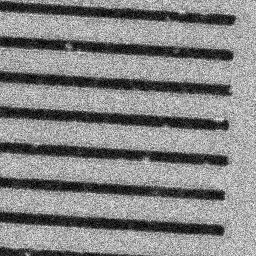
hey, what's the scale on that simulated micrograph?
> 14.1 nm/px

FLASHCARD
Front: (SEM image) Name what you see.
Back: parallel lines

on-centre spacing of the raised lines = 495 nm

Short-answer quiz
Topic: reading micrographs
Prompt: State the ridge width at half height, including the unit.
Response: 192 nm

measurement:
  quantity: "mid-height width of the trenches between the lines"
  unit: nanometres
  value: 300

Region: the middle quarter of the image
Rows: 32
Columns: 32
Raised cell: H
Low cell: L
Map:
LLLLLLLLLLLLLLLLLLLLLLLLLLLLLLLL
LLLLLLLLLLLLLLLLLLLLLLLLLLLLLLLL
LLLLLLLLLLLLLLLLLLLLLLLLLLLLLLLL
HHHHHHHHHHHHHHHHLLLLLLLLLLLLLLLL
HHHHHHHHHHHHHHHHHHHHHHHHHHHHHHHH
HHHHHHHHHHHHHHHHHHHHHHHHHHHHHHHH
LLLLLLLLLLHLHHHHHHHHHHHHHHHHHHHH
LLLLLLLLLLLLLLLLLLLLLLLLLLLLLHHH
LLLLLLLLLLLLLLLLLLLLLLLLLLLLLLLL
LLLLLLLLLLLLLLLLLLLLLLLLLLLLLLLL
LLLLLLLLLLLLLLLLLLLLLLLLLLLLLLLL
HHHHHLLLLLLLLLLLLLLLLLLLLLLLLLLL
HHHHHLHHHHHHHHHHHHHHHHLLLLLLLLLL
HHHHHHHHHHHHHHHHHHHHHHHHHHHHHHHH
HHHHHHHHHHHHHHHHHHHHHHHHHHHHHHHH
LLLLLLLLLLLLLLLHHHHHHHHHHLHHHHHH
LLLLLLLLLLLLLLLLLLLLLLLLLLLLLLHL
LLLLLLLLLLLLLLLLLLLLLLLLLLLLLLLL
LLLLLLLLLLLLLLLLLLLLLLLLLLLLLLLL
LLLLLLLLLLLLLLLLLLLLLLLLLLLLLLLL
HHHHHHHLLLLLLLLLLLLLLLLLLLLLLLLL
HHHHHHHHHHHHHHHHHHHHHHHLLLLLLLLL
HHHHHHHHHHHHHHHHHHHHHLHHHHHHHHHH
LHHHHHHHHHHHHHHHHHHHLHHHHHHHHHHH
LLLLLLLLLLLLLLLLLLHHLHHHHHHHHHHH
LLLLLLLLLLLLLLLLLLLLLLLLLLLLLLLL
LLLLLLLLLLLLLLLLLLLLLLLLLLLLLLLL
LLLLLLLLLLLLLLLLLLLLLLLLLLLLLLLL
LLLLLLLLLLLLLLLLLLLLLLLLLLLLLLLL
HHHHHHHHHLLLLLLLLLLLLLLLLLLLLLLL
HHHHHHHHHHHHHHHHHHHHHHHHHHLLLLLL
HHHHHHHHHHHHHHHHHHHHHHHLHHHHHLHH